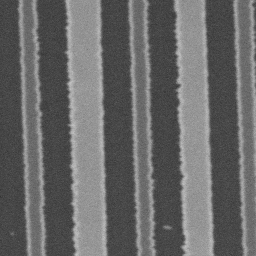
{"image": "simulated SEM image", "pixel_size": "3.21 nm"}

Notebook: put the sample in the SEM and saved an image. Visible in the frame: lines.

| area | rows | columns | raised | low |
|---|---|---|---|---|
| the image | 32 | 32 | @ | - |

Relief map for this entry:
---@----@@@@----@@----@@@@---@@@
--@@----@@@@@---@@----@@@@---@@@
---@@----@@@@---@@----@@@@---@@@
---@@---@@@@@---@@----@@@@---@@@
---@@---@@@@@---@@----@@@@---@@@
---@@----@@@@---@@----@@@@---@@@
---@@---@@@@@---@@----@@@@----@@
---@@----@@@@---@@----@@@@----@@
---@@----@@@@---@@@---@@@@----@@
---@@----@@@@---@@@---@@@@----@@
---@@----@@@@----@@---@@@@----@@
---@@----@@@@----@@---@@@@----@@
---@@----@@@@----@@---@@@@----@@
---@@----@@@@----@@---@@@@----@@
---@@----@@@@----@@---@@@@----@@
---@@----@@@@----@@---@@@@----@@
---@@----@@@@----@@----@@@----@@
---@@----@@@@----@@---@@@@----@@
---@@----@@@@----@@----@@@----@@
---@@----@@@@----@@----@@@----@@
---@@----@@@@----@@----@@@----@@
---@@----@@@@----@@----@@@----@@
---@@----@@@@----@@----@@@----@@
---@@----@@@@----@@----@@@----@@
---@@----@@@@----@@----@@@----@@
---@@----@@@@----@@----@@@----@@
---@@----@@@@----@@----@@@----@@
---@@----@@@@----@@----@@@@---@@
---@@----@@@@----@@----@@@@---@@
---@@@---@@@@----@@----@@@@---@@
----@----@@@@----@@----@@@@---@@
----@@---@@@@----@@----@@@@----@